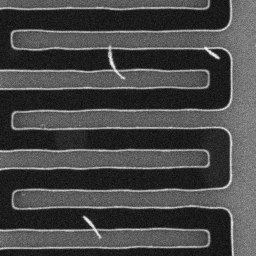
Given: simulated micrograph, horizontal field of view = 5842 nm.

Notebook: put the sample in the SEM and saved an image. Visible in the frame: groups of lines, slits or small figures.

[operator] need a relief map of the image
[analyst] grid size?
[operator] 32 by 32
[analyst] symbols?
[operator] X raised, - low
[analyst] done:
--------------------------XXX---
XXXXXXXXXXXXXXXXXXXXXXXXXXXXX---
XXXXXXXXXXXXXXXXXXXXXXXXXXXXX---
XXXXXXXXXXXXXXXXXXXXXXXXXXXX----
X-------------------------------
XX------------------------------
XXXXXXXXXXXXXXXXXXXXXXXXXXXX----
XXXXXXXXXXXXXXXXXXXXXXXXXXXXX---
XXXXXXXXXXXXXXXXXXXXXXXXXXXXX---
--------------------------XXX---
--------------------------XXX---
XXXXXXXXXXXXXXXXXXXXXXXXXXXXX---
XXXXXXXXXXXXXXXXXXXXXXXXXXXXX---
XXXXXXXXXXXXXXXXXXXXXXXXXXXX----
XX------------------------------
XX------------------------------
XXXXXXXXXXXXXXXXXXXXXXXXXXXX----
XXXXXXXXXXXXXXXXXXXXXXXXXXXXX---
XXXXXXXXXXXXXXXXXXXXXXXXXXXXX---
--------------------------XXX---
--------------------------XXX---
XXXXXXXXXXXXXXXXXXXXXXXXXXXXX---
XXXXXXXXXXXXXXXXXXXXXXXXXXXXX---
XXXXXXXXXXXXXXXXXXXXXXXXXXXX----
XX------------------------------
XX------------------------------
XXXXXXXXXXXXXXXXXXXXXXXXXXXXX---
XXXXXXXXXXXXXXXXXXXXXXXXXXXXX---
XXXXXXXXXXXXXXXXXXXXXXXXXXXXX---
--------------------------XXX---
--------------------------XXX---
XXXXXXXXXXXXXXXXXXXXXXXXXXXXX---